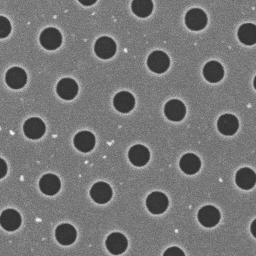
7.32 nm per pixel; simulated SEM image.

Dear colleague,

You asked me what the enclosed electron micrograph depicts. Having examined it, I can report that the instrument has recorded a regular array of holes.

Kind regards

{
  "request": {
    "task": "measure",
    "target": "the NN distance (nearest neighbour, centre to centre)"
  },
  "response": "51.8 px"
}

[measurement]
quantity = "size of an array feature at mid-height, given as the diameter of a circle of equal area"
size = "163 nm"